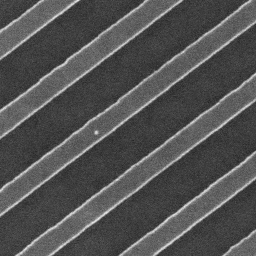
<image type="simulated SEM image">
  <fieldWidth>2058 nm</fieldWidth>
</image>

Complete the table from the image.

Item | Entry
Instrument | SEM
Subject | lines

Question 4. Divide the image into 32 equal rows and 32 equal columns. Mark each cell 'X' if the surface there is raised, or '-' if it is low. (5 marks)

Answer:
-----XXXX---------XXXX---------X
---XXXXX--------XXXXX--------XXX
--XXXXX--------XXXX---------XXXX
-XXXX---------XXXX---------XXXX-
XXXX--------XXXXX--------XXXXX--
XXX--------XXXXX--------XXXX----
X---------XXXX---------XXXX-----
--------XXXXX--------XXXXX------
-------XXXXX--------XXXX--------
------XXXX---------XXXX---------
-----XXXX--------XXXXX--------XX
---XXXXX--------XXXX---------XXX
--XXXX---------XXXX---------XXXX
XXXXX---------XXXX--------XXXXX-
XXXX--------XXXXX--------XXXX---
XX---------XXXX---------XXXX----
X--------XXXXX--------XXXXX-----
--------XXXXX--------XXXX-------
-------XXXX---------XXXX--------
-----XXXXX--------XXXXX--------X
----XXXXX--------XXXX---------XX
---XXXX---------XXXX---------XXX
--XXXX--------XXXXX--------XXXXX
XXXXX--------XXXXX--------XXXX--
XXX---------XXXX---------XXXX---
XX--------XXXXX--------XXXXX----
X--------XXXXX--------XXXX------
--------XXXX---------XXXX-------
------XXXXX---------XXXX--------
-----XXXXX--------XXXXX--------X
----XXXX---------XXXX---------XX
---XXXX--------XXXXX--------XXXX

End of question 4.